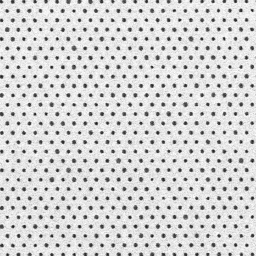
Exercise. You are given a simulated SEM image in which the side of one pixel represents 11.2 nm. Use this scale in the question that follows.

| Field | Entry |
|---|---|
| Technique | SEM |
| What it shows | a regular array of holes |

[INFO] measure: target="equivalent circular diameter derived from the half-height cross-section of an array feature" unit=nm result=47.4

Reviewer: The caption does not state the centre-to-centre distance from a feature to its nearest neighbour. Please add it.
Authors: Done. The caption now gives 10.6 pixels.